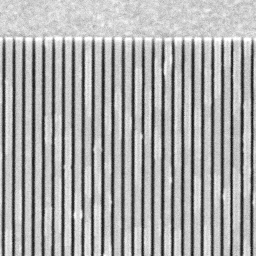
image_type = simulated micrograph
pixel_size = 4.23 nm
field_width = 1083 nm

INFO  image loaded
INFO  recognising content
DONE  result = parallel lines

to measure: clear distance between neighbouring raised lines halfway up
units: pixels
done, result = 2.88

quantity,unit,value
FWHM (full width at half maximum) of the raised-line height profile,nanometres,27.5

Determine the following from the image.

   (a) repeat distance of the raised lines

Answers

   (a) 42 nm